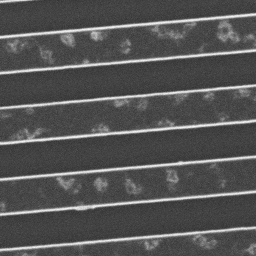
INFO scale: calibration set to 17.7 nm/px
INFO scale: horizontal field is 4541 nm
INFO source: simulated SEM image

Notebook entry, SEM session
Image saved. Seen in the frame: one or a few lines or trenches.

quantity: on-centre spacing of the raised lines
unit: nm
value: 1250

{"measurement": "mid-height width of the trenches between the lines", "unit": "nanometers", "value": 634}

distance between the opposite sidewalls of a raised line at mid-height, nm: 634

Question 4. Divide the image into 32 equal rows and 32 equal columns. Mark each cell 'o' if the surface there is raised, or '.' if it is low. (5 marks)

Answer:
................................
................................
........................oooooooo
.............ooooooooooooooooooo
..oooooooooooooooooooooooooooooo
oooooooooooooooooooooooooooooooo
oooooooooooooooooooooooooooooo..
ooooooooooooooooooo.............
ooooooo.........................
................................
................................
.......................ooooooooo
...........ooooooooooooooooooooo
oooooooooooooooooooooooooooooooo
oooooooooooooooooooooooooooooooo
ooooooooooooooooooooooooooo.....
oooooooooooooooo................
ooooo...........................
................................
................................
......................oooooooooo
...........ooooooooooooooooooooo
oooooooooooooooooooooooooooooooo
oooooooooooooooooooooooooooooooo
oooooooooooooooooooooooooo......
ooooooooooooooo.................
ooo.............................
................................
................................
.....................ooooooooooo
.........ooooooooooooooooooooooo
oooooooooooooooooooooooooooooooo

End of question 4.